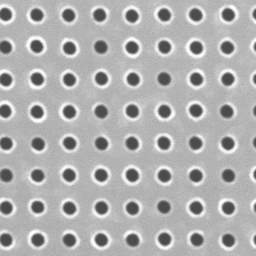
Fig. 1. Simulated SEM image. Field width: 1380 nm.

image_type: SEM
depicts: a regular array of holes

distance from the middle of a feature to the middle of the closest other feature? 169 nm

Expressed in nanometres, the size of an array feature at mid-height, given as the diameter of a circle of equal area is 73.1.